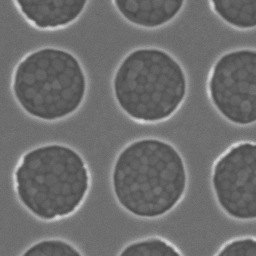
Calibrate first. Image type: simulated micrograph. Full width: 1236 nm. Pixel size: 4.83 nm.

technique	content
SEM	holes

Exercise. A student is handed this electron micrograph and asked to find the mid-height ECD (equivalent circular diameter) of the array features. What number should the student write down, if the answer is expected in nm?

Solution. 341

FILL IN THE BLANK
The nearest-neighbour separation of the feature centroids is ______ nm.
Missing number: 460